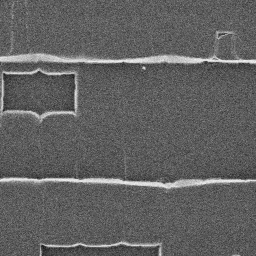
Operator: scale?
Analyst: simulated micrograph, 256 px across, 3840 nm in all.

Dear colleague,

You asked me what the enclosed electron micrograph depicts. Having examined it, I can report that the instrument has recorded wiring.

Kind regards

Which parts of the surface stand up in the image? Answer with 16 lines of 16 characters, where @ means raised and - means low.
@@@@@@@@@@@@@@@@
@@@@@@@@@@@@@@@@
@@@@@@@@@@@@@@@@
@@@@@@@@@@@@@@@@
----------------
----------------
----------------
----------------
----------------
----------------
----------------
@@@@@@@@@--@@@@@
@@@@@@@@@@@@@@@@
@@@@@@@@@@@@@@@@
@@@@@@@@@@@@@@@@
@@@-------@@@@@@